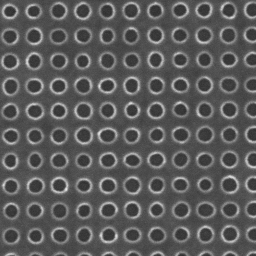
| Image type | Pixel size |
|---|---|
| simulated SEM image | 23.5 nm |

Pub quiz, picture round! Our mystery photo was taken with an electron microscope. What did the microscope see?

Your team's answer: a regular array of holes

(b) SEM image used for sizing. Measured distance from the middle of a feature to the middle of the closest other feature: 565 nanometres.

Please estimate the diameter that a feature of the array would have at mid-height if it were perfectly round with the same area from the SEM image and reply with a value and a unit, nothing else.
324 nanometres